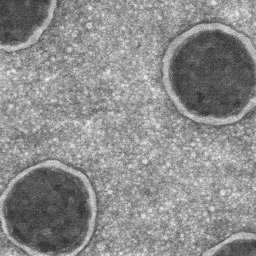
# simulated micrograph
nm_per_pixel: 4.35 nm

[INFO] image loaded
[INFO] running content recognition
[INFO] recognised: raised bodies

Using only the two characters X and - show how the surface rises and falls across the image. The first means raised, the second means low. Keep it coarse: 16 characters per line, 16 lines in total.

XXX-------------
XXX-------------
XX---------XXXX-
-----------XXXXX
----------XXXXXX
-----------XXXXX
-----------XXXXX
-------------X--
----------------
----------------
--XX------------
-XXXX-----------
XXXXXX----------
XXXXXX----------
XXXXXX----------
--XXX---------XX